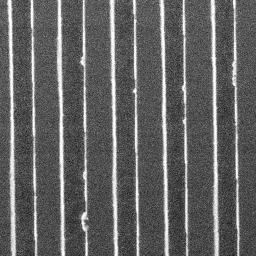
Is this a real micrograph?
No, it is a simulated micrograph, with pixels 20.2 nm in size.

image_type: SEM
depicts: lines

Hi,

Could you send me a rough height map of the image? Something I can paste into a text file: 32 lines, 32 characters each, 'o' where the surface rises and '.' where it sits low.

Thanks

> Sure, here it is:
o...ooo...oooo...ooo...oooo..ooo
o...ooo...oooo...ooo...oooo..ooo
o...ooo...oooo...ooo...oooo..ooo
o...ooo...oooo...ooo...oooo..ooo
o...ooo...oooo...ooo...oooo..ooo
o...ooo...oooo...ooo...oooo..ooo
o...ooo...oooo...ooo...oooo..ooo
o...ooo...oooo...ooo...oooo..ooo
o...ooo...oooo...ooo...oooo..ooo
o...ooo....ooo...oooo..oooo..ooo
o...ooo....ooo...oooo..oooo..ooo
o...oooo...ooo...oooo..oooo..ooo
oo..oooo...ooo...oooo..oooo..ooo
oo..oooo...ooo...oooo..oooo..ooo
oo..oooo...ooo...oooo..oooo..ooo
oo..oooo...ooo...oooo..oooo...oo
oo..oooo...ooo...oooo..oooo...oo
oo..oooo...ooo...oooo..oooo...oo
oo..oooo...ooo...oooo..oooo...oo
oo..oooo...ooo...oooo..oooo...oo
oo..oooo...ooo...oooo..oooo...oo
oo..oooo...ooo...oooo..oooo...oo
oo..oooo...ooo...oooo..oooo...oo
oo..oooo...ooo...oooo..oooo...oo
oo..oooo...ooo...oooo..oooo...oo
oo..oooo...ooo...oooo..oooo...oo
oo..oooo...ooo...oooo..oooo...oo
oo..oooo..oooo...oooo..oooo...oo
oo..oooo..oooo...oooo..oooo...oo
oo..oooo...ooo...oooo..oooo...oo
oo...ooo...oooo..oooo..oooo...oo
oo...ooo...oooo..oooo..oooo...oo